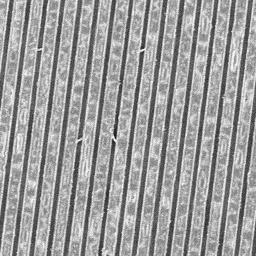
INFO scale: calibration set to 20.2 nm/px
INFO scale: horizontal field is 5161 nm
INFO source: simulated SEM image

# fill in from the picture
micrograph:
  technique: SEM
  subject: parallel lines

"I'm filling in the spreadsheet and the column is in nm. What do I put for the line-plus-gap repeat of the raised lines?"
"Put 342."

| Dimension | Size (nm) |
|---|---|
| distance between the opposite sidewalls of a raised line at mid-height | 223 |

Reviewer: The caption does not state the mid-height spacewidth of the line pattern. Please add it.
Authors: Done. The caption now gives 120 nm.